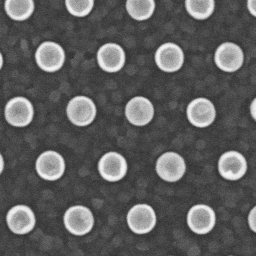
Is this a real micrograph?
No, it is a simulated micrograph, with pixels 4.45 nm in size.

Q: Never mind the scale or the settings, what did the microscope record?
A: a regular array of raised bodies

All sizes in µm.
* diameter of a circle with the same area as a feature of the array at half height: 0.127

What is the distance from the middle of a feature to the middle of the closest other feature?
262 nanometres